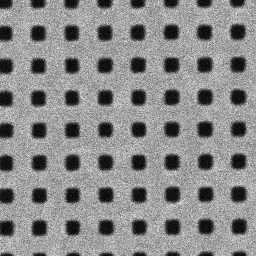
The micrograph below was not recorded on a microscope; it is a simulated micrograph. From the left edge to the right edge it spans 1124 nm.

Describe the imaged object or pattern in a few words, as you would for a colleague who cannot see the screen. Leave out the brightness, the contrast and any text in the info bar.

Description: a regular array of holes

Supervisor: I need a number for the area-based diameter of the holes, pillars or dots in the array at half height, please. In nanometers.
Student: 72.1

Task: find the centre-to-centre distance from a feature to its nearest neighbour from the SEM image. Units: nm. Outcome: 142